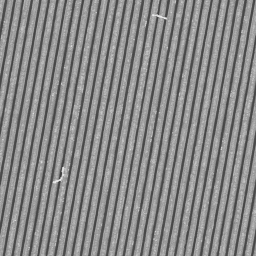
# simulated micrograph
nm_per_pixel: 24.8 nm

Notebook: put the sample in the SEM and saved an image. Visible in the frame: parallel lines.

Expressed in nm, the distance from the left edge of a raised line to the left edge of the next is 209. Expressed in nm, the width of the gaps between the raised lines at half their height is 64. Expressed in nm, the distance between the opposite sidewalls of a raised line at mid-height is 152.